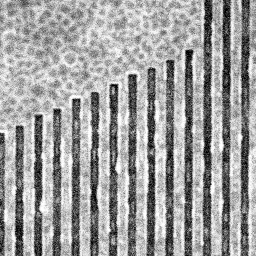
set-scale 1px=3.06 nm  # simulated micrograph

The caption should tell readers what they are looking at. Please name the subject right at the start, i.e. parallel lines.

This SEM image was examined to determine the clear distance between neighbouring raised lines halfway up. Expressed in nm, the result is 25.6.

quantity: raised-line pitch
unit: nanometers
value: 57.8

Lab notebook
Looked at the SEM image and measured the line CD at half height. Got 31 nm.